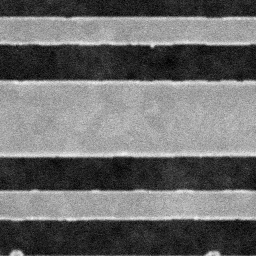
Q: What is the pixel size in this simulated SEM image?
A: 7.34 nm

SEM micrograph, lines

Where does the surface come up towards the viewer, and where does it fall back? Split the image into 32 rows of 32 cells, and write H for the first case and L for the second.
LLLLLLLLLLLLLLLLLLLLLLLLLLLLLLLL
LLLLLLLLLLLLLLLLLLLLLLLLLLLLLLLL
HHHHHHHHHHHHHHHHHHHHHHHHHHHHHHHH
HHHHHHHHHHHHHHHHHHHHHHHHHHHHHHHH
HHHHHHHHHHHHHHHHHHHHHHHHHHHHHHHH
LHLLLHHHLLHHLLHHLHHHHHLLLLHHHHHL
LLLLLLLLLLLLLLLLLLLLLLLLLLLLLLLL
LLLLLLLLLLLLLLLLLLLLLLLLLLLLLLLL
LLLLLLLLLLLLLLLLLLLLLLLLLLLLLLLL
LLLLLLLLLLLLLLLLLLLLLLLLLLLLLLLL
HHHHHHHHHHHHHHHHHHHHHHHHHHHHHHHH
HHHHHHHHHHHHHHHHHHHHHHHHHHHHHHHH
HHHHHHHHHHHHHHHHHHHHHHHHHHHHHHHH
HHHHHHHHHHHHHHHHHHHHHHHHHHHHHHHH
HHHHHHHHHHHHHHHHHHHHHHHHHHHHHHHH
HHHHHHHHHHHHHHHHHHHHHHHHHHHHHHHH
HHHHHHHHHHHHHHHHHHHHHHHHHHHHHHHH
HHHHHHHHHHHHHHHHHHHHHHHHHHHHHHHH
HHHHHHHHHHHHHHHHHHHHHHHHHHHHHHHH
LLLLLLLLLLLLLLLLLLLLLLLLLLLLLLLL
LLLLLLLLLLLLLLLLLLLLLLLLLLLLLLLL
LLLLLLLLLLLLLLLLLLLLLLLLLLLLLLLL
LLLLLLLLLLLLLLLLLLLLLLLLLLLLLLLL
LLLLLLLLLLLLLLLLLLLLLLLLLLLLLLLL
HHHHHHHHHHHHHHHHHHHHHHHHHHHHHHHH
HHHHHHHHHHHHHHHHHHHHHHHHHHHHHHHH
HHHHHHHHHHHHHHHHHHHHHHHHHHHHHHHH
LHHLLLLLHHLLLLLLLLLLLLLLLLLLLLLL
LLLLLLLLLLLLLLLLLLLLLLLLLLLLLLLL
LLLLLLLLLLLLLLLLLLLLLLLLLLLLLLLL
LLLLLLLLLLLLLLLLLLLLLLLLLLLLLLLL
LLLLLLLLLLLLLLLLLLLLLLLLLLLLLLLL